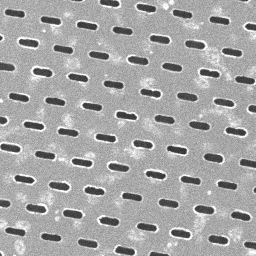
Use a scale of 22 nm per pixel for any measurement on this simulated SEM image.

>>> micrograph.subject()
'a regular array of holes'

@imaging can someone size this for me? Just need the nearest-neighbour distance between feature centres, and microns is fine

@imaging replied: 0.69